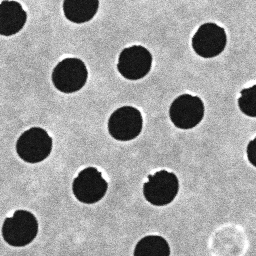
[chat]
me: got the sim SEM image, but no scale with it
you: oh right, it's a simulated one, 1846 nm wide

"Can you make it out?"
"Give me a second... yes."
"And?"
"a regular array of holes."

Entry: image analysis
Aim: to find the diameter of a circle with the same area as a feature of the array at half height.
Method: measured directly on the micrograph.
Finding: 35.9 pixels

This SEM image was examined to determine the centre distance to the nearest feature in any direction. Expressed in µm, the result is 0.497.